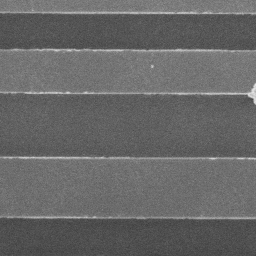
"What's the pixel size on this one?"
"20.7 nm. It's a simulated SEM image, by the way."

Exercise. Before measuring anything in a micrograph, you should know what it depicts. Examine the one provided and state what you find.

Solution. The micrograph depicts lines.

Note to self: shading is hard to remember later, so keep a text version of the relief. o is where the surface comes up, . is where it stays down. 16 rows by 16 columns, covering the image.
oooooooooooooooo
................
................
oooooooooooooooo
oooooooooooooooo
oooooooooooooooo
................
................
................
................
oooooooooooooooo
oooooooooooooooo
oooooooooooooooo
oooooooooooooooo
................
................